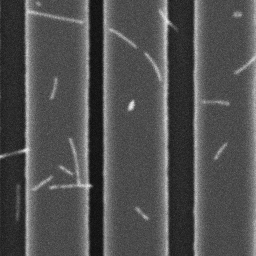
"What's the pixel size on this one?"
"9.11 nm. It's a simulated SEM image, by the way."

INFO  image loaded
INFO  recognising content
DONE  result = lines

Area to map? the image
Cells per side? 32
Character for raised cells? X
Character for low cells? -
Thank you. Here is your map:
---XXXXXXXX--XXXXXXXX---XXXXXXXX
---XXXXXXXX--XXXXXXXX---XXXXXXXX
---XXXXXXXX--XXXXXXXX---XXXXXXXX
---XXXXXXXX--XXXXXXXX---XXXXXXXX
---XXXXXXXX--XXXXXXXX---XXXXXXXX
---XXXXXXXX--XXXXXXXX---XXXXXXXX
---XXXXXXXX--XXXXXXXX---XXXXXXXX
---XXXXXXXX--XXXXXXXX---XXXXXXXX
---XXXXXXXX--XXXXXXXX---XXXXXXXX
---XXXXXXXX--XXXXXXXX---XXXXXXXX
---XXXXXXXX--XXXXXXXX---XXXXXXXX
---XXXXXXXX--XXXXXXXX---XXXXXXXX
---XXXXXXXX--XXXXXXXX---XXXXXXXX
---XXXXXXXX--XXXXXXXX---XXXXXXXX
---XXXXXXXX--XXXXXXXX---XXXXXXXX
---XXXXXXXX--XXXXXXXX---XXXXXXXX
---XXXXXXXX--XXXXXXXX---XXXXXXXX
---XXXXXXXX--XXXXXXXX---XXXXXXXX
---XXXXXXXX--XXXXXXXX---XXXXXXXX
---XXXXXXXX--XXXXXXXX---XXXXXXXX
---XXXXXXXX--XXXXXXXX---XXXXXXXX
---XXXXXXXX--XXXXXXXX---XXXXXXXX
---XXXXXXXX--XXXXXXXX---XXXXXXXX
---XXXXXXXX--XXXXXXXX---XXXXXXXX
---XXXXXXXX--XXXXXXXX---XXXXXXXX
---XXXXXXXX--XXXXXXXX---XXXXXXXX
---XXXXXXXX--XXXXXXXX---XXXXXXXX
---XXXXXXXX--XXXXXXXX---XXXXXXXX
---XXXXXXXX--XXXXXXXX---XXXXXXXX
---XXXXXXXX--XXXXXXXX---XXXXXXXX
---XXXXXXXX--XXXXXXXX---XXXXXXXX
---XXXXXXXX--XXXXXXXX---XXXXXXXX